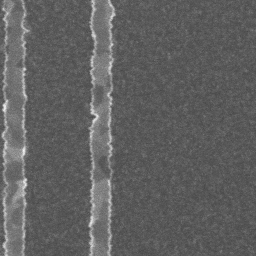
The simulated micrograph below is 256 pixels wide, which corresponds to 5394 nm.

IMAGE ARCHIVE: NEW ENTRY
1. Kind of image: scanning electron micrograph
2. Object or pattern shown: one or a few lines or trenches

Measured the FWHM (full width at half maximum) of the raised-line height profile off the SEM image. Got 406 nanometers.